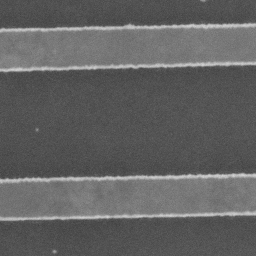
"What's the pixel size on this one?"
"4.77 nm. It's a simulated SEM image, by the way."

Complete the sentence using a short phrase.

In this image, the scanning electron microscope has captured lines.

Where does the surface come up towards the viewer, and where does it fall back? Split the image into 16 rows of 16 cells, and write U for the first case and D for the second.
DDDDDDDDDDDDDDDD
DDDDDDDDDDDDDDDD
UUUUUUUUUUUUUUUU
UUUUUUUUUUUUUUUU
DDDDDDDDDDDDDDDD
DDDDDDDDDDDDDDDD
DDDDDDDDDDDDDDDD
DDDDDDDDDDDDDDDD
DDDDDDDDDDDDDDDD
DDDDDDDDDDDDDDDD
DDDDDDDDDDDDDDDD
UUUUUUUUUUUUUUUU
UUUUUUUUUUUUUUUU
UUUUUUUUUUUUDDDD
DDDDDDDDDDDDDDDD
DDDDDDDDDDDDDDDD